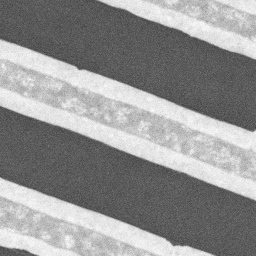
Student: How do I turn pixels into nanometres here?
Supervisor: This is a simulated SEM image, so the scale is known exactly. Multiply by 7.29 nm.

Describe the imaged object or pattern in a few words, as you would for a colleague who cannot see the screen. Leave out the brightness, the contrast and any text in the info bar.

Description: one or a few lines or trenches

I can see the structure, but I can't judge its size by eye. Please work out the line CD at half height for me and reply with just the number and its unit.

0.311 micrometres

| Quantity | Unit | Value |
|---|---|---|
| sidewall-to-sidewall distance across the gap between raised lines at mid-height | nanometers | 644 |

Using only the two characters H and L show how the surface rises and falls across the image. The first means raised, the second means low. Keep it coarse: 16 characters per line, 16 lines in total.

LLLLLLLLLHHHHHHH
LLLLLLLLLLLLHHHH
LLLLLLLLLLLLLLHH
HLLLLLLLLLLLLLLL
HHHHLLLLLLLLLLLL
HHHHHHHLLLLLLLLL
LHHHHHHHHLLLLLLL
LLLLHHHHHHHHLLLL
LLLLLLLHHHHHHHHL
LLLLLLLLLLHHHHHH
LLLLLLLLLLLLHHHH
LLLLLLLLLLLLLLLH
HHLLLLLLLLLLLLLL
HHHHHLLLLLLLLLLL
HHHHHHHLLLLLLLLL
LLLHHHHHHHLLLLLL